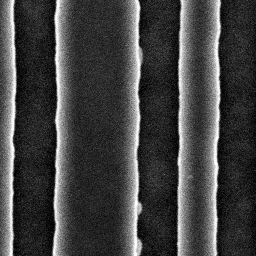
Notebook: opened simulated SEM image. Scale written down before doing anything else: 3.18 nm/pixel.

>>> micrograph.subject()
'lines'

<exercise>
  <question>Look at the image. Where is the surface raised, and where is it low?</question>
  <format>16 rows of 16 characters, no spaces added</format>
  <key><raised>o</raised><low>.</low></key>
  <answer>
o...ooooo..ooo..
o...ooooo..ooo..
o...ooooo..ooo..
o...ooooo..ooo..
o...ooooo..ooo..
o...ooooo..ooo..
o...ooooo..ooo..
o...ooooo..ooo..
o...ooooo..ooo..
o...ooooo..ooo..
o...ooooo..ooo..
o..oooooo..ooo..
o..oooooo..oo...
o..oooooo..ooo..
o..oooooo..ooo..
o..oooooo..ooo..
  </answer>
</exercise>